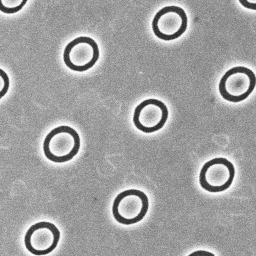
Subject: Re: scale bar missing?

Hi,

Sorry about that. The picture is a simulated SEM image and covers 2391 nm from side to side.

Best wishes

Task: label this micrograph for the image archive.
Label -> ring-shaped grooves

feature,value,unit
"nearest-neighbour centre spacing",860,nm